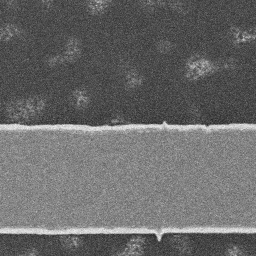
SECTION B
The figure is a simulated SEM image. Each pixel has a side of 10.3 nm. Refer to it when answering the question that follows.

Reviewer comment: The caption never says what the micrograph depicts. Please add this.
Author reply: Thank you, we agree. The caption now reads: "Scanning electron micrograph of one or a few lines or trenches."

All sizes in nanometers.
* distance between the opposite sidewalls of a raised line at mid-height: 1070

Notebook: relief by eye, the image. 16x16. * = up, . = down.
................
................
................
................
................
................
................
................
****************
****************
****************
****************
****************
****************
.........*......
................